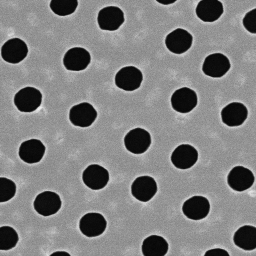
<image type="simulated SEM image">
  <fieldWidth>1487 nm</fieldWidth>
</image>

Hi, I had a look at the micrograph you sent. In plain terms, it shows a regular array of holes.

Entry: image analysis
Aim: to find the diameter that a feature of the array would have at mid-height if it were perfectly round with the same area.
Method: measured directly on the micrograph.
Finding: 25.1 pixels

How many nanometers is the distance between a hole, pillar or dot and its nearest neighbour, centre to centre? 294